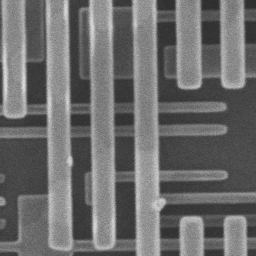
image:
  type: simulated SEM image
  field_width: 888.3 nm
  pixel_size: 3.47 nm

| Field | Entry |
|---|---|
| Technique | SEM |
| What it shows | wiring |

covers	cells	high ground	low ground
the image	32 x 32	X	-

XXX---XXX--XXX---XXX--XXX---XX--
XXX---XXX--XXX---XXX--XXX---XX--
XXX---XXX--XXX---XXX--XXX---XX--
XXX---XXX--XXX---XXX--XXX---XX--
XXX---XXX--XXX---XXX--XXX---XX--
XXX---XXX--XXX---XXX--XXX---XX--
XXX---XXX--XXX---XXX--XXX---XX--
XXX---XXX--XXX---XXX--XXX---XX--
XXX---XXX--XXX---XXX--XXX---XX--
XXX---XXX--XXX---XXX--XXX---XXX-
XXX---XXX--XXX---XXX--XXX---XX--
XXX---XXX--XXX---XXX------------
XXX---XXX--XXX---XXX------------
XXX---XXX--XXX---XXX------------
-XX---XXX--XXX---XXX------------
------XXX--XXX---XXX------------
------XXX--XXX---XXX------------
------XXX--XXX---XXX------------
------XXX--XXX---XXX------------
------XXX--XXX---XXX------------
------XXX---XX---XXX------------
------XXX---XX---XXX------------
------XXX---XX---XXX------------
------XXX---XX---XXX------------
------XXX---XX---XXX------------
------XXX---XX---XXXX-----------
------XXX---XX---XXX------------
------XXX---XX---XXX---XX---XXX-
------XXX---XX---XXX---XX---XXX-
------XXX---XX---XXX---XX---XXX-
------XXX---XX---XXX---XX---XXX-
-----------------XXX---XX---XXX-